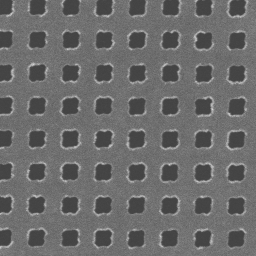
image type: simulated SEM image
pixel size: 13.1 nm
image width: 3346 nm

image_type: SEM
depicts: a regular array of holes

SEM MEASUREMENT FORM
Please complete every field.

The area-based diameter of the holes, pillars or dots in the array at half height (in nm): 231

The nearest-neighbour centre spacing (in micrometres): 0.429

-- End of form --